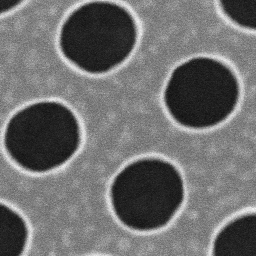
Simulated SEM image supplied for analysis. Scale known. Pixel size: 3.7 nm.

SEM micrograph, holes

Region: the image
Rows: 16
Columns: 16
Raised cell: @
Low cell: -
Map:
-@@@@---@@@@@@--
@@@@----@@@@@@@-
@@@@-----@@@@@@@
@@@@----@@@@@@@@
@@@@@--@@@@----@
@@@@@@@@@@-----@
@@--@@@@@@-----@
@----@@@@@@---@@
-----@@@@@@@@@@@
-----@@@@@@@@@@@
@--@@@@@---@@@@@
@@@@@@@----@@@@@
@@@@@@@----@@@@@
-@@@@@@----@@@@-
--@@@@@@@@@@@@--
--@@@@@@@@@@@---